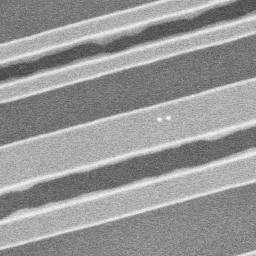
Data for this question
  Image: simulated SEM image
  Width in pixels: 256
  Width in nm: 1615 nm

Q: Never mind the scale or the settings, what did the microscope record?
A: lines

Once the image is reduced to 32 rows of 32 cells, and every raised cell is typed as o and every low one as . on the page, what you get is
...................oooooooo.....
...............ooooooooo........
...........ooooooooo..........oo
.......oooooooooo.........oooooo
....oooooooooo.........oooooooo.
ooooooooo..........oooooooo.....
oooooo.........oooooooo.........
oo.........ooooooooo............
.......ooooooooo................
....oooooooo....................
ooooooooo....................ooo
ooooo.....................oooooo
oo....................oooooooooo
..................oooooooooooooo
..............oooooooooooooooooo
...........oooooooooooooooooooo.
.......ooooooooooooooooooooo....
...ooooooooooooooooooooo........
oooooooooooooooooooo............
oooooooooooooooo..............oo
ooooooooooooo..............ooooo
ooooooooo.............oooooooooo
ooooo..............ooooooooooooo
oo..............ooooooooooooo...
...........oooooooooooooo.......
........ooooooooooooo...........
....oooooooooooooo..............
.ooooooooooooo..................
oooooooooo......................
oooooo..........................
ooo.............................
...............................o